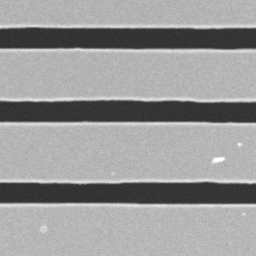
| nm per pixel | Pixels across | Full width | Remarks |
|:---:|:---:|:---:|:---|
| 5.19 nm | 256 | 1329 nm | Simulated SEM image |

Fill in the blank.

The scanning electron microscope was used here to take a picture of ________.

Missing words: lines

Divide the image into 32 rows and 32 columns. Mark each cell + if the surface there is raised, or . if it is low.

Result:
++++++++++++++++++++++++++++++++
++++++++++++++++++++++++++++++++
++++++++++++++++++++++++++++++++
+.......................++++....
................................
................................
++++++++++++++++++++++++++++++++
++++++++++++++++++++++++++++++++
++++++++++++++++++++++++++++++++
++++++++++++++++++++++++++++++++
++++++++++++++++++++++++++++++++
++++++++++++++++++++++++++++++++
++++++++++++++++++++++++++++++++
................................
................................
++++++++++++++++++++++++++++++++
++++++++++++++++++++++++++++++++
++++++++++++++++++++++++++++++++
++++++++++++++++++++++++++++++++
++++++++++++++++++++++++++++++++
++++++++++++++++++++++++++++++++
++++++++++++++++++++++++++++++++
++++++++++++++++++++++++++++++++
................................
................................
+++++++++++++++++...............
++++++++++++++++++++++++++++++++
++++++++++++++++++++++++++++++++
++++++++++++++++++++++++++++++++
++++++++++++++++++++++++++++++++
++++++++++++++++++++++++++++++++
++++++++++++++++++++++++++++++++